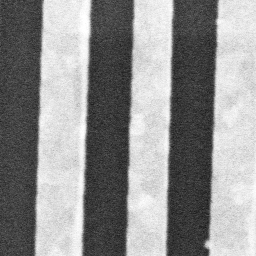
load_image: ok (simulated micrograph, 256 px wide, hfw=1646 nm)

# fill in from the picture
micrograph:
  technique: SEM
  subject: lines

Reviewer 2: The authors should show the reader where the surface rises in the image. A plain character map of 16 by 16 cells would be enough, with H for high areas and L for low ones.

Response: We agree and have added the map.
LLLHHLLLHHHLLLHH
LLLHHLLLHHHLLLHH
LLLHHLLLHHHLLLHH
LLLHHLLLHHHLLLHH
LLLHHLLLHHHLLLHH
LLLHHLLLHHHLLHHH
LLLHHLLLHHHLLHHH
LLHHHLLLHHLLLHHH
LLHHHLLLHHLLLHHH
LLHHHLLLHHLLLHHH
LLHHHLLLHHLLLHHH
LLHHHLLLHHLLLHHH
LLHHHLLLHHLLLHHH
LLHHHLLLHHLLLHHH
LLHHHLLLHHLLLHHH
LLHHHLLLHHLLLHHH